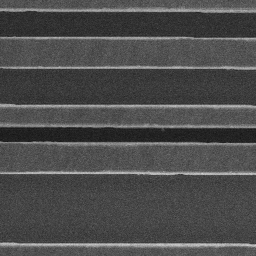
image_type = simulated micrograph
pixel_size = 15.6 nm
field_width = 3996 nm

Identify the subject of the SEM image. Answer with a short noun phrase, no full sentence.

lines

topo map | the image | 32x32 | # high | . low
################################
................................
................................
................................
................................
################################
################################
################################
.###############################
................................
................................
................................
................................
################################
################################
################################
................................
................................
################################
################################
################################
################################
................................
................................
................................
................................
................................
................................
................................
................................
................................
################################